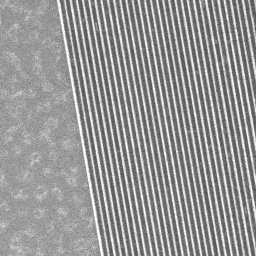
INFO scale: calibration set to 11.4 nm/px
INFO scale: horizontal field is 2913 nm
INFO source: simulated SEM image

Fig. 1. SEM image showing parallel lines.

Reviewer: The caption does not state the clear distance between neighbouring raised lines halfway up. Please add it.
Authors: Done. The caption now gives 53.3 nm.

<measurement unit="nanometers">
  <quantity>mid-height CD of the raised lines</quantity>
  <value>11.2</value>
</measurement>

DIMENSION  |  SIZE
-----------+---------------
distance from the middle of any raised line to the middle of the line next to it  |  68.9 nanometres